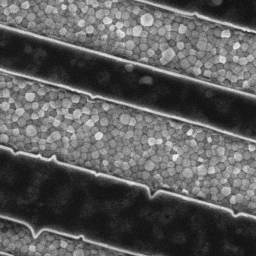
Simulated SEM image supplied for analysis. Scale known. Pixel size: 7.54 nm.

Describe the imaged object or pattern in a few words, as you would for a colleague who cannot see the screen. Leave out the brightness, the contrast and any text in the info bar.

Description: one or a few lines or trenches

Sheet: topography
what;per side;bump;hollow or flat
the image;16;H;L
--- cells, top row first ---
LLLLLLLLLLHHHHHH
LLLLLLLLLLLLLLHH
HHHLLLLLLLLLLLLL
HHHHHHHLLLLLLLLL
HHHHHHHHHHHLLLLL
LLLLHHHHHHHHHHLL
LLLLLLLLHHHHHHHH
LLLLLLLLLLLHHHHH
LLLLLLLLLLLLLLLH
HLLLLLLLLLLLLLLL
HHHHHLLLLLLLLLLL
HHHHHHHHHLLLLLLL
HHHHHHHHHHHHLLLL
HHHHHHHHHHHHHHHH
LLHHHHHHHHHHHHHH
LLLLLLLHHHHHHHHH